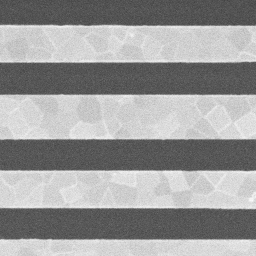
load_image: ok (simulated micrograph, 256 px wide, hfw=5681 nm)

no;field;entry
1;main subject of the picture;lines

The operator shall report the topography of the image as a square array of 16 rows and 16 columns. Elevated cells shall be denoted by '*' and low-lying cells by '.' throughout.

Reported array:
................
................
****************
****************
................
................
****************
****************
****************
................
................
****************
****************
................
................
****************